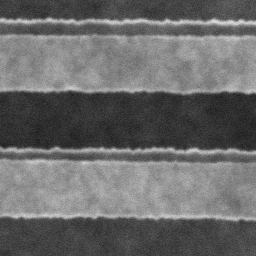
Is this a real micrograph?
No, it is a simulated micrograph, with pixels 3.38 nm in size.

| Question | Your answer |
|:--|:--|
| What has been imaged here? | lines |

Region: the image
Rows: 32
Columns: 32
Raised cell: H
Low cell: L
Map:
LLLLLLLLLLLLLLLLLLLLLLLLLLLLLLLL
LLLLLLLLLLLLLLLLLLLLLLLLLLLLLLLL
LLLLLLHLLLLLLLLLLLLLLLLLLLLLLLLL
HHHHHHHHHHHHHHHHHHHHHHHHHHHHHHHH
HHHHHHHHHHHHHHHHHHHHHHHHHHHHHHHH
HHHHHHHHHHHHHHHHHHHHHHHHHHHHHHHH
HHHHHHHHHHHHHHHHHHHHHHHHHHHHHHHH
HHHHHHHHHHHHHHHHHHHHHHHHHHHHHHHH
HHHHHHHHHHHHHHHHHHHHHHHHHHHHHHHH
HHHHHHHHHHHHHHHHHHHHHHHHHHHHHHHH
HHHHHHHHHHHHHHHHHHHHHHHHHHHHHHHH
LLLLLLLLLLLLLLLLLLLLLLHHLLLLLLHH
LLLLLLLLLLLLLLLLLLLLLLLLLLLLLLLL
LLLLLLLLLLLLLLLLLLLLLLLLLLLLLLLL
LLLLLLLLLLLLLLLLLLLLLLLLLLLLLLLL
LLLLLLLLLLLLLLLLLLLLLLLLLLLLLLLL
LLLLLLLLLLLLLLLLLLLLLLLLLLLLLLLL
LLLLLLLLLLLLLLLLLLLLLLLLLLLLLLLL
LLLLLLLLLLLLLLLLLLLLLLLLLLLLLLLL
HHHHHHHHHHHHHHHHHHHHHHHHHHHHHHHH
HHHHHHHHHHHHHHHHHHHHHHHHHHHHHHHH
HHHHHHHHHHHHHHHHHHHHHHHHHHHHHHHH
HHHHHHHHHHHHHHHHHHHHHHHHHHHHHHHH
HHHHHHHHHHHHHHHHHHHHHHHHHHHHHHHH
HHHHHHHHHHHHHHHHHHHHHHHHHHHHHHHH
HHHHHHHHHHHHHHHHHHHHHHHHHHHHHHHH
HHHHHHHHHHHHHHHHHHHHHHHHHHHHHHHH
LLLLLLLLLLLLLLLLLLLLLLLLLLLLLLLL
LLLLLLLLLLLLLLLLLLLLLLLLLLLLLLLL
LLLLLLLLLLLLLLLLLLLLLLLLLLLLLLLL
LLLLLLLLLLLLLLLLLLLLLLLLLLLLLLLL
LLLLLLLLLLLLLLLLLLLLLLLLLLLLLLLL